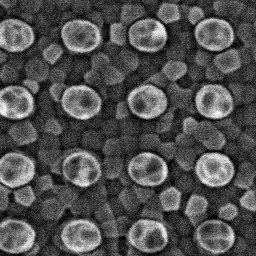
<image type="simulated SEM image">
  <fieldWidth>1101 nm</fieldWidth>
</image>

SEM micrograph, a regular array of raised bodies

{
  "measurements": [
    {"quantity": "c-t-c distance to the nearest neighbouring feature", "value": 286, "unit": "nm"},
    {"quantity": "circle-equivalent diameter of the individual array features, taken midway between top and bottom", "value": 148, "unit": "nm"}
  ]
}